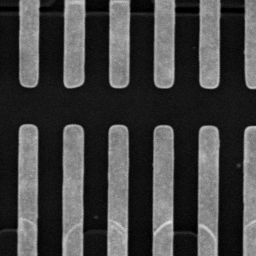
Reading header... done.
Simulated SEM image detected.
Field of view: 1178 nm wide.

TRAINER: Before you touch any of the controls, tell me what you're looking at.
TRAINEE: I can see wiring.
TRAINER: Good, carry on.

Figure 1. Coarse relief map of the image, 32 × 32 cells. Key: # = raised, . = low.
...##...##....##...###...##....#
...##...##....##...###...##....#
...##...##....##...###...##....#
...##...##....##...###...##....#
...##...##....##...###...##....#
...##...##....##...###...##....#
...##...##....##...###...##....#
...##...##....##...###...##....#
...##...##....##...###...##....#
...##...##....##...###...##....#
...#....##....##...###...##....#
................................
................................
................................
................................
................................
..###...##....##...###...##....#
..###...##....##...###...##....#
..###...##....##...###...##....#
..###...##....##...###...##....#
..###...##....##...###...##....#
..###...##....##...###...##....#
..###...##....##...###...##....#
..###...##....##...###...##....#
..###...##....##...###...##....#
..###...##....##...###...##....#
..###...##....##...###...##....#
..###...##....##...###...##....#
..###...##....##...###...##....#
#####...##...###...########...##
#####...##...###...########...##
#####...##...###...########...##